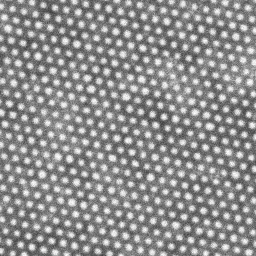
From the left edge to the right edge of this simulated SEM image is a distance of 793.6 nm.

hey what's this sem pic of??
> a regular array of raised bodies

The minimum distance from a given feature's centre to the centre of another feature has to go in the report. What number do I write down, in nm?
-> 35.7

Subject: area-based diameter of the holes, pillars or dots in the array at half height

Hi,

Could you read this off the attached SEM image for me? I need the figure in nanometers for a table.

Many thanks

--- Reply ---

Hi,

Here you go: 18.5